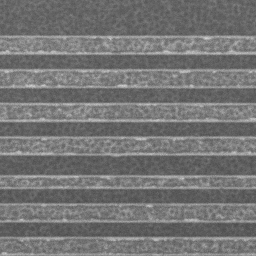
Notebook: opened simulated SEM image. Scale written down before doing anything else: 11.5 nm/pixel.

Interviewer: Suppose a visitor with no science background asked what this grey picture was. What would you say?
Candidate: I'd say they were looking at parallel lines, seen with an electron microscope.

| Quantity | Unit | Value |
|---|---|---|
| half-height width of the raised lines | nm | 193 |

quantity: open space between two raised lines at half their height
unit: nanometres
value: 192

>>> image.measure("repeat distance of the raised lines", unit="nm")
387